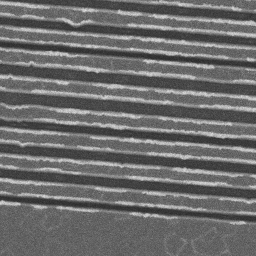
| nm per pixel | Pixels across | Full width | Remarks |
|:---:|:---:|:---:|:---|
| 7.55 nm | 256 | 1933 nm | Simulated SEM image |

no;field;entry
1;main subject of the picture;parallel lines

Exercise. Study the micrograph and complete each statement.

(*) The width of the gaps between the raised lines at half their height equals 10.2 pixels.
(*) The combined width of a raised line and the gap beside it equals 0.191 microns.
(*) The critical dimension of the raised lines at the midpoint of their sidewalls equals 0.115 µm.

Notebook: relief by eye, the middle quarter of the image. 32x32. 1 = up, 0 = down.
11111111111111111111111111111111
00000111111111111111111111111111
00000000000000000000111111111111
00000000000000000000000000000001
11100000000000000000000000000000
11111111111111100000000000000000
11111111111111111111111110000000
11111111111111111111111111111111
00000000011111111111111111111111
00000000000000000000111111111111
00000000000000000000000000000001
11110000000000000000000000000000
11111111111111100000000000000000
11111111111111111111111111100000
11111111111111111111111111111111
00000000011111111111111111111111
00000000000000000001111111111111
10000000000000000000000000000000
11111111111111000000000000000000
11111111111111111111111110000000
11111111111111111111111111111111
00000000001111111111111111111111
00000000000000000000111111111111
00000000000000000000000000000110
11111111000000000000000000000000
11111111111111111111000000000000
11111111111111111111111111111111
00010011111111111111111111111111
00000000000000001111111111111111
00000000000000000000000000011111
11110000000000000000000000000000
11111111111111110000000000000000